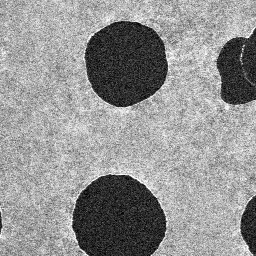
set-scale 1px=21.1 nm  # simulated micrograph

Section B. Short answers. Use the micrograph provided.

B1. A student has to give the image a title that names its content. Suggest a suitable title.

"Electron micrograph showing holes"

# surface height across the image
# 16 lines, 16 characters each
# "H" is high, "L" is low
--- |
HHHHHHHHHHHHHHHH
HHHHHHHLLHHHHHHH
HHHHHHLLLLHHHHLL
HHHHHLLLLLHHHHLL
HHHHHLLLLLHHHHLL
HHHHHHLLLLHHHHLL
HHHHHHHLLHHHHHLH
HHHHHHHHHHHHHHHH
HHHHHHHHHHHHHHHH
HHHHHHHHHHHHHHHH
HHHHHHHHHHHHHHHH
HHHHHHLLLHHHHHHH
HHHHHLLLLLHHHHHH
HHHHHLLLLLHHHHHL
HHHHHLLLLLHHHHHL
HHHHHLLLLLHHHHHL